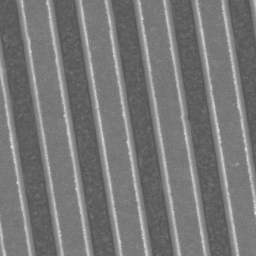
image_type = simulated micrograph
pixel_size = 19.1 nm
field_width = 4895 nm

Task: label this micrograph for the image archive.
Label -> parallel lines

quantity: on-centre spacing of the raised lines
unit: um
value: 1.1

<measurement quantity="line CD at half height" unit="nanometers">580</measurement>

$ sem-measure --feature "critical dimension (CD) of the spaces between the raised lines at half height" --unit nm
528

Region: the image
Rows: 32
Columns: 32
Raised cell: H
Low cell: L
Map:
LLHHHHLLLLHHHHLLLHHHHLLLHHHHLLLL
LLLHHHHLLLHHHHLLLHHHHLLLLHHHLLLL
LLLHHHHLLLHHHHLLLHHHHLLLLHHHLLLL
LLLHHHHLLLHHHHLLLLHHHLLLLHHHHLLL
LLLHHHHLLLHHHHLLLLHHHHLLLHHHHLLL
LLLHHHHLLLLHHHLLLLHHHHLLLHHHHLLL
LLLHHHHLLLLHHHHLLLHHHHLLLHHHHLLL
LLLLHHHLLLLHHHHLLLHHHHLLLHHHHLLL
LLLLHHHHLLLHHHHLLLHHHHLLLLHHHLLL
LLLLHHHHLLLHHHHLLLLHHHLLLLHHHHLL
HLLLHHHHLLLHHHHLLLLHHHHLLLHHHHLL
HLLLHHHHLLLLHHHLLLLHHHHLLLHHHHLL
HLLLHHHHLLLLHHHHLLLHHHHLLLHHHHLL
HLLLLHHHLLLLHHHHLLLHHHHLLLHHHHLL
HLLLLHHHHLLLHHHHLLLHHHHLLLLHHHLL
HLLLLHHHHLLLHHHHLLLLHHHLLLLHHHHL
HHLLLHHHHLLLHHHHLLLLHHHHLLLHHHHL
HHLLLHHHHLLLLHHHLLLLHHHHLLLHHHHL
HHLLLHHHHLLLLHHHLLLLHHHHLLLHHHHL
HHLLLHHHHLLLLHHHHLLLHHHHLLLHHHHL
HHLLLLHHHLLLLHHHHLLLHHHHLLLLHHHL
HHLLLLHHHHLLLHHHHLLLHHHHLLLLHHHH
HHHLLLHHHHLLLHHHHLLLLHHHLLLLHHHH
HHHLLLHHHHLLLHHHHLLLLHHHHLLLHHHH
HHHLLLHHHHLLLLHHHLLLLHHHHLLLHHHH
HHHLLLHHHHLLLLHHHHLLLHHHHLLLHHHH
HHHLLLLHHHLLLLHHHHLLLHHHHLLLLHHH
HHHLLLLHHHHLLLHHHHLLLHHHHLLLLHHH
HHHHLLLHHHHLLLHHHHLLLLHHHLLLLHHH
HHHHLLLHHHHLLLHHHHLLLLHHHHLLLHHH
HHHHLLLHHHHLLLLHHHLLLLHHHHLLLHHH
HHHHLLLHHHHLLLLHHHHLLLHHHHLLLHHH